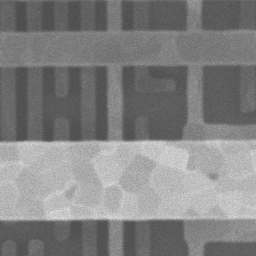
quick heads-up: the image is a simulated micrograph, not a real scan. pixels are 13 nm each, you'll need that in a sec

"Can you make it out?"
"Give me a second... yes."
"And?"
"wiring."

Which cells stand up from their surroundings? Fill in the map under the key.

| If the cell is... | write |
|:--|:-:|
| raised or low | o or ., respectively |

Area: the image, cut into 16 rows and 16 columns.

................
................
oooooooooooooooo
oooooooooooooooo
................
................
................
................
................
oooooooooooooooo
oooooooooooooooo
oooooooooooooooo
oooooooooooooooo
oooooooooooooooo
................
................